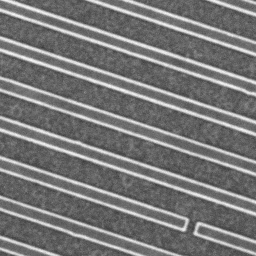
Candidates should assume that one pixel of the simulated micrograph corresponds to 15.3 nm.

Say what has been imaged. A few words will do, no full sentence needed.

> parallel lines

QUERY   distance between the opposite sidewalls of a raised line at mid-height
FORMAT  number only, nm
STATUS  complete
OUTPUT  183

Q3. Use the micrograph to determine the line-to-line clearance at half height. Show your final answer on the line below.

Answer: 395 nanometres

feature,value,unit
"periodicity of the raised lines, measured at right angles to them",578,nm